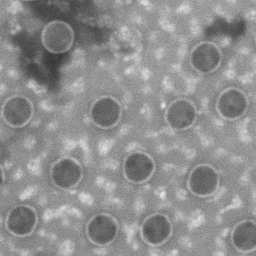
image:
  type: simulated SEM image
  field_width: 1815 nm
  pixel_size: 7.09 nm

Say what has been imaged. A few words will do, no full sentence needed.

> a regular array of raised bodies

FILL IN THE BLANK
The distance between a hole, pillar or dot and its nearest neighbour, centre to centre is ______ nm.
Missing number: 453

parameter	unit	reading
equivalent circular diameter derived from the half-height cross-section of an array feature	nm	225